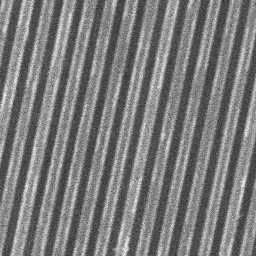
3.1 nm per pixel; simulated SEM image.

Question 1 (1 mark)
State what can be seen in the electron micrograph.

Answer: parallel lines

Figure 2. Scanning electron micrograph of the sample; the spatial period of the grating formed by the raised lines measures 63.1 nanometers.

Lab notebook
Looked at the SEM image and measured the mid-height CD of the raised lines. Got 34.6 nm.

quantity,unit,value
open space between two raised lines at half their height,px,9.32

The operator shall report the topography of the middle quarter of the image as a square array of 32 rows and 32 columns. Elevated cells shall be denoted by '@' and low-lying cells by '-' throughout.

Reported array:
--@@@--@@@--@@@--@@@---@@---@@@-
--@@---@@@--@@@--@@@--@@@---@@--
-@@@---@@---@@@--@@@--@@@--@@@--
-@@@--@@@---@@---@@@--@@@--@@@--
-@@@--@@@--@@@---@@---@@@--@@@--
-@@@--@@@--@@@--@@@---@@---@@@--
-@@---@@@--@@@--@@@--@@@---@@---
@@@---@@---@@@--@@@--@@@--@@@---
@@@--@@@---@@---@@@--@@@--@@@--@
@@@--@@@--@@@---@@---@@@--@@@--@
@@@--@@@--@@@--@@@---@@---@@@--@
@@---@@@--@@@--@@@--@@@---@@---@
@@---@@---@@@--@@@--@@@--@@@---@
@@--@@@---@@---@@@--@@@--@@@--@@
@@--@@@--@@@---@@---@@---@@@--@@
@---@@@--@@@--@@@---@@---@@@--@@
@---@@---@@@--@@@--@@@---@@---@@
@---@@---@@---@@@--@@@--@@@---@@
@--@@@---@@---@@---@@---@@@--@@@
@--@@@--@@@---@@---@@---@@@--@@@
---@@@--@@@--@@@---@@---@@---@@-
---@@---@@@--@@@--@@@---@@---@@-
--@@@---@@---@@@--@@@--@@@---@@-
--@@@--@@@---@@---@@---@@@--@@@-
--@@@--@@@--@@@---@@---@@@--@@@-
--@@@--@@@--@@@--@@@---@@---@@--
--@@---@@@--@@@--@@@--@@@---@@--
-@@@---@@---@@@--@@@--@@@--@@@--
-@@@--@@@---@@---@@@--@@@--@@@--
-@@@--@@@--@@@---@@---@@@--@@@--
-@@@--@@@--@@@--@@@---@@---@@---
-@@---@@@--@@@--@@@--@@@---@@---